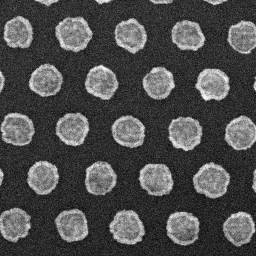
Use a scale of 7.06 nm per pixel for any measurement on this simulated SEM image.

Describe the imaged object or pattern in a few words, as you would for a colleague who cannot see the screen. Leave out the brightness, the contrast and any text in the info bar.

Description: a regular array of raised bodies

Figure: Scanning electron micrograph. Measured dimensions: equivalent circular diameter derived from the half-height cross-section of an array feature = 225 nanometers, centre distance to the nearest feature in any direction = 385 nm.